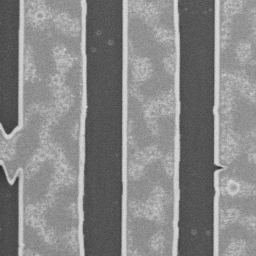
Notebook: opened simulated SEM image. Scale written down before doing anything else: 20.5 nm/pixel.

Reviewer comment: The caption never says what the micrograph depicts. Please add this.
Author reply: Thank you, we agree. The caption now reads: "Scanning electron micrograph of one or a few lines or trenches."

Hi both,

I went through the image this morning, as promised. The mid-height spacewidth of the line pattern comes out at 841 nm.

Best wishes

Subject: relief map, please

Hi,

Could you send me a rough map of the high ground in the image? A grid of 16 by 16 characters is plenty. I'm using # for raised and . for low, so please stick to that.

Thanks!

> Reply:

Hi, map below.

.####...###...##
.####...###...##
.####...###...##
.####...###...##
.####...###...##
.####...###...##
.####...###..###
.####...###..###
#####...###...##
#####...###...##
#####...###...##
.####...###...##
.####...###...##
.####...###...##
.####...###...##
.####...###...##